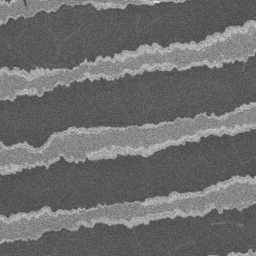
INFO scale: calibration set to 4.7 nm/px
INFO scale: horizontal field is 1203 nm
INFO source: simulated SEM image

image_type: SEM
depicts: one or a few lines or trenches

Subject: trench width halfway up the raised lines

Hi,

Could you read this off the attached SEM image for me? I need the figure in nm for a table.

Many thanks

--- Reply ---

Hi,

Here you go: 218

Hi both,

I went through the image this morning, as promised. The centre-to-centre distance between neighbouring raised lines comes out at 0.34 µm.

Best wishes